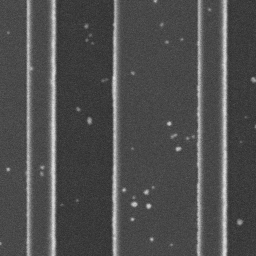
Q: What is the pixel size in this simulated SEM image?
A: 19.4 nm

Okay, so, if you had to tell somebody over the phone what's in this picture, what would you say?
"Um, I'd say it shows lines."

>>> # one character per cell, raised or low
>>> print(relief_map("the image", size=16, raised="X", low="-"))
XXX----XXXXXXX--
XXX----XXXXXXX--
XXX----XXXXXXX--
XXX----XXXXXXX--
XXX----XXXXXXX--
XXX----XXXXXXX--
XXX----XXXXXXX--
XXX----XXXXXXX--
XXX----XXXXXXX--
XXX----XXXXXXX--
XXX----XXXXXXX--
XXX----XXXXXXX--
XXX----XXXXXXX--
XXX----XXXXXXX--
XXX----XXXXXXX--
XXX----XXXXXXX--